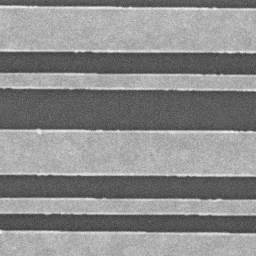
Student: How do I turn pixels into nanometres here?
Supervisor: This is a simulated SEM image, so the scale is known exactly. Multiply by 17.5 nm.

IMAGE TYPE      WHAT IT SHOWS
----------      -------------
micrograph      lines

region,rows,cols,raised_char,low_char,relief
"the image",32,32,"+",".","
................................
++++++++++++++++++++++++++++++++
++++++++++++++++++++++++++++++++
++++++++++++++++++++++++++++++++
++++++++++++++++++++++++++++++++
++++++++++++++++++++++++++++++++
...........................+++++
................................
................................
++++++++++++++++++++++++++++++++
++++++++++++++++++++++++++++++++
................................
................................
................................
................................
................................
++++++++++++++++++++++++++++++..
++++++++++++++++++++++++++++++++
++++++++++++++++++++++++++++++++
++++++++++++++++++++++++++++++++
++++++++++++++++++++++++++++++++
++++++++++++++++++++++++++++++++
................................
................................
................................
++++++++++++++++++++++++++++++++
++++++++++++++++++++++++++++++++
................................
................................
++++++++++++++++++++++++++++++++
++++++++++++++++++++++++++++++++
++++++++++++++++++++++++++++++++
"